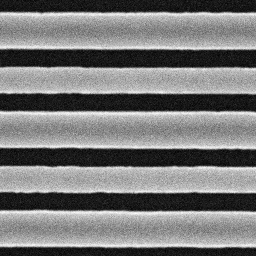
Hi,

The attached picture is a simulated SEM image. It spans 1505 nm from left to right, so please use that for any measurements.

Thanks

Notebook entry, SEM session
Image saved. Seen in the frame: lines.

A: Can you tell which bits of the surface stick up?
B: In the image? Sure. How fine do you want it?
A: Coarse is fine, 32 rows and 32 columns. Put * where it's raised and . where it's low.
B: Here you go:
................................
................................
********************************
********************************
********************************
********************************
................................
................................
***********................***..
********************************
********************************
********************************
................................
................................
********************************
********************************
********************************
********************************
......*...**********************
................................
................................
********************************
********************************
********************************
................................
................................
********************************
********************************
********************************
********************************
********************************
................................